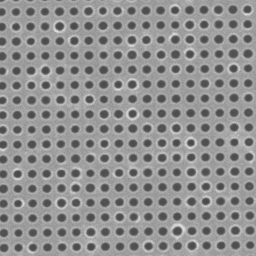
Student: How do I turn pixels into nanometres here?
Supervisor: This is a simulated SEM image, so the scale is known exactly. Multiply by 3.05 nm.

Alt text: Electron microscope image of a regular array of holes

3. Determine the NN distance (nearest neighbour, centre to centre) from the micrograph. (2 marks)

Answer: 43.4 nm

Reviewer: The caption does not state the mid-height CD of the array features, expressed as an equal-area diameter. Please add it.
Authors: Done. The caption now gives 26.7 nanometres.